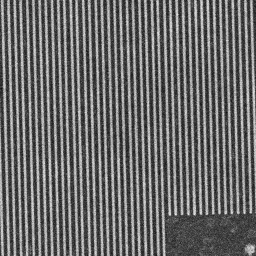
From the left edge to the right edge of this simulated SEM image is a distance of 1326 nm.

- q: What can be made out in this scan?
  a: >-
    parallel lines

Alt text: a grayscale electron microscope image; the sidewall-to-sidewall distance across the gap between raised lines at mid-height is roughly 22.7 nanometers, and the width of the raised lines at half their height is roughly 9.7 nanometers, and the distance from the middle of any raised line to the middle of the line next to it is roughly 6.22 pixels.